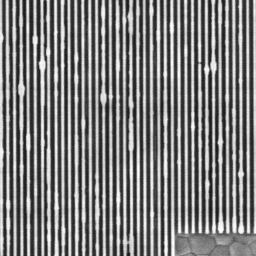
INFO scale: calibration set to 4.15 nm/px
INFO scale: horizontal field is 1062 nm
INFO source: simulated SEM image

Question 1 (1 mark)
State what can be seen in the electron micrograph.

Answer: parallel lines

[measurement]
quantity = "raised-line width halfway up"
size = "11.9 nm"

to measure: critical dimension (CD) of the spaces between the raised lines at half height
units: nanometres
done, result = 16.1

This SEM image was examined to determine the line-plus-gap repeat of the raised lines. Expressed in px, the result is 6.87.